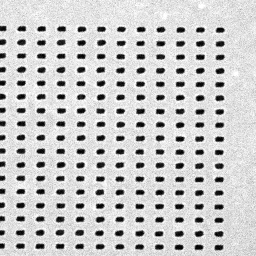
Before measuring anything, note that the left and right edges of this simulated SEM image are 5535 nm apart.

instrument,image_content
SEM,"a regular array of holes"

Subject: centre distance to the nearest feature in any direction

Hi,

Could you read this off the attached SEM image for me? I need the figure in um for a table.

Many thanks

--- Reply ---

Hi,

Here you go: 0.289